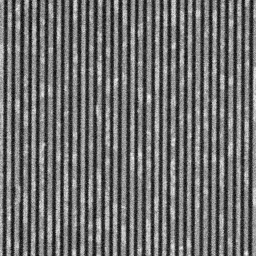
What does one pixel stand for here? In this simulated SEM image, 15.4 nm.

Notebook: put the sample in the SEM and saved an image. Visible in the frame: parallel lines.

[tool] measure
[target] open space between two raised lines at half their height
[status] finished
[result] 0.0674 um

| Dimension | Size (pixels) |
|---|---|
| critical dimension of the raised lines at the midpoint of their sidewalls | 3.5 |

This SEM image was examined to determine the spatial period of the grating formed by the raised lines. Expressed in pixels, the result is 8.19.